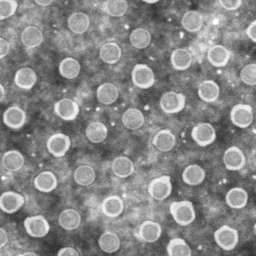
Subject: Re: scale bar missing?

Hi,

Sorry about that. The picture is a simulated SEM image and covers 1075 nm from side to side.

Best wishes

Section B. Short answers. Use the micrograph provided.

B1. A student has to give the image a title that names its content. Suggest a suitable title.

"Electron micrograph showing a regular array of raised bodies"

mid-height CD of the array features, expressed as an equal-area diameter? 87.2 nanometers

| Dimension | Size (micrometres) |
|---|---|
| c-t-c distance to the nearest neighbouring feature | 0.153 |